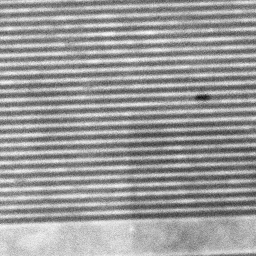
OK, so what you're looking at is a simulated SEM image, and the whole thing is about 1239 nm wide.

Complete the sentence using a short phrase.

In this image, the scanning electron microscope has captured parallel lines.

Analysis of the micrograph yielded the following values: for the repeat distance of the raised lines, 43.2 nm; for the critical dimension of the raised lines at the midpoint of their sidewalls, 1.76 px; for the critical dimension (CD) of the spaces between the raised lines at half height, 34.5 nanometres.